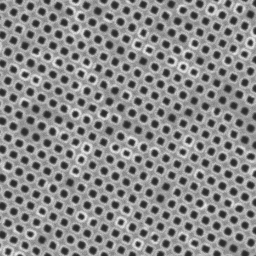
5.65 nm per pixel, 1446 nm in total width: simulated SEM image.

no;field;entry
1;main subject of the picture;a regular array of holes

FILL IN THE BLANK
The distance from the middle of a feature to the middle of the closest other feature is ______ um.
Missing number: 0.0698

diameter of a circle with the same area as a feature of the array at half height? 46 nm